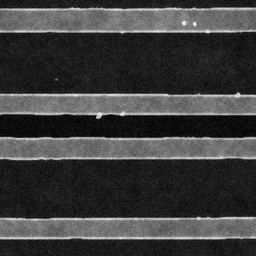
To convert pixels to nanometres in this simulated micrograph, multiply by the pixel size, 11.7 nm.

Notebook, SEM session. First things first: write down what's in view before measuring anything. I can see lines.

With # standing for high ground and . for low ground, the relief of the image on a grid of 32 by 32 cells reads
................................
################################
################################
################################
................................
................................
................................
................................
................................
................................
................................
................................
################################
################################
............#...................
................................
................................
################################
################################
################################
................................
................................
................................
................................
................................
................................
................................
################################
################################
################################
................................
................................